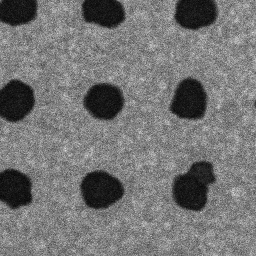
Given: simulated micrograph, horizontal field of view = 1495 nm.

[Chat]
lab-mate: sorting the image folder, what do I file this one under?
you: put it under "holes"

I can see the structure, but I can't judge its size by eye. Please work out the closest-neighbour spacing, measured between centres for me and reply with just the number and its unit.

502 nm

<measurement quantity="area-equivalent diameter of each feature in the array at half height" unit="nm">230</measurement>